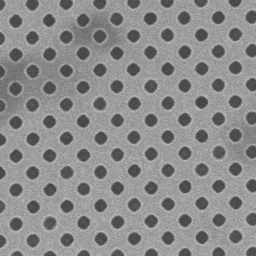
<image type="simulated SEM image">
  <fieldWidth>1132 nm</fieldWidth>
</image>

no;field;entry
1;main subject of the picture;a regular array of holes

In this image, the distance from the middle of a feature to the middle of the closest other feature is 104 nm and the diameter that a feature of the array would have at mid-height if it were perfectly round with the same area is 56.9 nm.